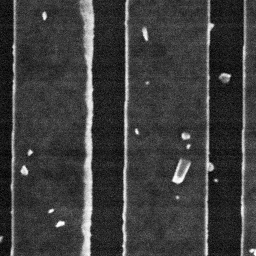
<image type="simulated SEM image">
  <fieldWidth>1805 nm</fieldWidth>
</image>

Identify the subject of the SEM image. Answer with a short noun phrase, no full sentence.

lines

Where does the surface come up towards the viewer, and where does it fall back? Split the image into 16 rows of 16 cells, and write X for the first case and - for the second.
-XXXXX--XXXXX--X
-XXXXX--XXXXX--X
-XXXXX--XXXXX--X
-XXXXX--XXXXX--X
-XXXXX--XXXXX--X
-XXXXX--XXXXX--X
-XXXXX--XXXXX--X
-XXXXX--XXXXX--X
-XXXXX--XXXXX--X
-XXXXX--XXXXX--X
-XXXXX--XXXXX--X
-XXXXX--XXXXX--X
-XXXXX--XXXXX--X
-XXXXX--XXXXX--X
-XXXXX--XXXXX--X
-XXXXX--XXXXX--X